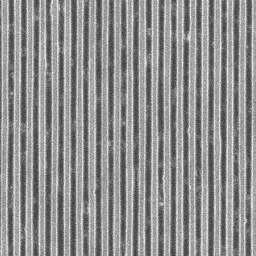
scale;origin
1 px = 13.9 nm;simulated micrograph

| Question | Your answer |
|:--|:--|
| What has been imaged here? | parallel lines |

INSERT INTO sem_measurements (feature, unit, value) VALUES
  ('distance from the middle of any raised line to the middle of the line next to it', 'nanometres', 174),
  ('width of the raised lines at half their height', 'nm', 106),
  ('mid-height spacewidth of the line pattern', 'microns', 0.0643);